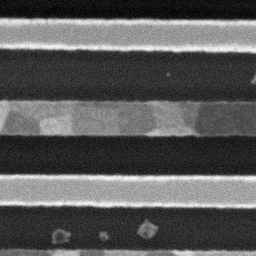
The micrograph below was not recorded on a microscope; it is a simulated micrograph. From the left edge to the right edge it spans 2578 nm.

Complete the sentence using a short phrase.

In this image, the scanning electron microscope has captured lines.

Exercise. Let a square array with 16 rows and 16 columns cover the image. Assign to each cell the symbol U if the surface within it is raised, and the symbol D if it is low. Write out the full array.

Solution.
DDDDDDDDDDDDDDDD
UUUUUUUUUUUUUUUU
UUUUUUUUUUUUUUUU
DDDDDDDDDDDDDDDD
DDDDDDDDDDDDDDDD
DDDDDDDDDDDDDDDD
UUUUUUUUUUUUUUUU
UUUUUUUUUUUUUUUU
DDDDDDDDDDDDDDDD
DDDDDDDDDDDDDDDD
DDDDDDDDDDDDDDDD
UUUUUUUUUUUUUUUU
UUUUUUUUUUUUUUUU
DDDDDDDDDDDDDDDD
DDDDDDDDDDDDDDDD
DDDDDDDDDDDDDDDD